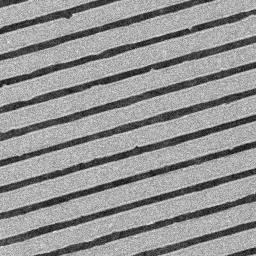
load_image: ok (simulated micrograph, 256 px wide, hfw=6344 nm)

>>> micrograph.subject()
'parallel lines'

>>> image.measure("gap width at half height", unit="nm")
226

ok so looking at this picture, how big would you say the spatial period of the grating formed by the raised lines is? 0.631 micrometres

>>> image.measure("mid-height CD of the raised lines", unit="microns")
0.408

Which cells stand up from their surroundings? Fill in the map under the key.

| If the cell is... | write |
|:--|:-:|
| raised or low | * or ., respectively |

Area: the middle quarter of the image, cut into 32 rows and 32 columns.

....****************........****
***************.........********
************........************
********.........***************
*****.........**************....
*.........***************.......
......***************..........*
...***************........******
**************.........*********
***********........*************
********.........**************.
****........**************......
*........**************.........
......**************.........***
..**************..........******
*************........***********
*********.........**************
*******.......***************...
**.........****************.....
......****************.........*
....**************.........*****
***************.........********
************........************
*******.........****************
*****........***************....
*.........***************.......
.....****************........***
...***************........******
**************.........*********
**********.........*************
*******........***************..
***.........***************.....